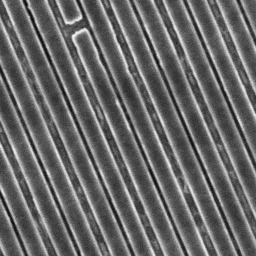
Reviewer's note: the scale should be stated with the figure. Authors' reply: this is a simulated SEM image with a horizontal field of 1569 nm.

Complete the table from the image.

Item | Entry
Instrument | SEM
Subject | parallel lines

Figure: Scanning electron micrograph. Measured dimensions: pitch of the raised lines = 150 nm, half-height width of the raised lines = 111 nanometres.